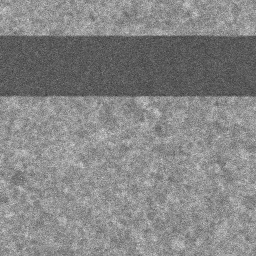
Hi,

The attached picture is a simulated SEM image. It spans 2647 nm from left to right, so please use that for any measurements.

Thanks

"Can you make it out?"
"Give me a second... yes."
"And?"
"one or a few lines or trenches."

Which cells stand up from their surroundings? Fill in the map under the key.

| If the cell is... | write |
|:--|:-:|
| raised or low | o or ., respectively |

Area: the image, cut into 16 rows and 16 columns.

oooooooooooooooo
oooooooooooooooo
................
................
................
................
oooooooooooooooo
oooooooooooooooo
oooooooooooooooo
oooooooooooooooo
oooooooooooooooo
oooooooooooooooo
oooooooooooooooo
oooooooooooooooo
oooooooooooooooo
oooooooooooooooo